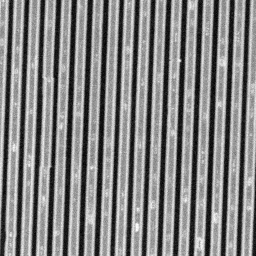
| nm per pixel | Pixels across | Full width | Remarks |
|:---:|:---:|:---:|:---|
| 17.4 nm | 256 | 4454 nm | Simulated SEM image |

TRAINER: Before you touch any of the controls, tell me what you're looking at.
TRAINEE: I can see parallel lines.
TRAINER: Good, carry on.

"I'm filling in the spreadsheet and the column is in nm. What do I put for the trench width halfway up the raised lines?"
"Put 128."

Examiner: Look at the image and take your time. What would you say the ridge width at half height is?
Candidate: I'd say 148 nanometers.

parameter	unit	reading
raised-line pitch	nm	274